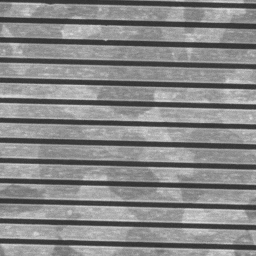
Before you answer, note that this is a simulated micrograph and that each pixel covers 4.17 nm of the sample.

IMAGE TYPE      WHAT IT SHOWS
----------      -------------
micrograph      parallel lines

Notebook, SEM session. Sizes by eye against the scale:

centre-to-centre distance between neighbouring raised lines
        0.0837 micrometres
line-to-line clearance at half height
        22.9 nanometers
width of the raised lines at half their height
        60.4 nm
